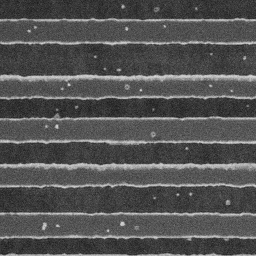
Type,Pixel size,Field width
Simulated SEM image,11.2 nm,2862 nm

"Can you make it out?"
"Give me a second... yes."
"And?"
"lines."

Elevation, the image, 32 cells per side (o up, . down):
................................
................................
oooooooooooooooooooooooooooooooo
oooooooooooooooooooooooooooooooo
oooooooooooooooooooooooooooooooo
................................
................................
................................
................................
...........o..............o.....
oooooooooooooooooooooooooooooooo
oooooooooooooooooooooooooooooooo
................................
................................
................................
oooooooooooooooooooooooooooooooo
oooooooooooooooooooooooooooooooo
oooooooooooooooooooooooooooooooo
................................
................................
....o...........................
oooooooooooooooooooooooooooooooo
oooooooooooooooooooooooooooooooo
................................
................................
................................
................................
oooooooooooooooooooooooooooooooo
oooooooooooooooooooooooooooooooo
oooooooooooooooooooooooooooooooo
................................
................................